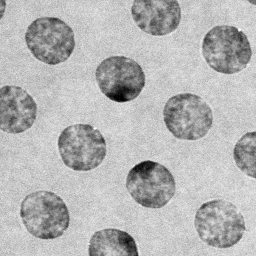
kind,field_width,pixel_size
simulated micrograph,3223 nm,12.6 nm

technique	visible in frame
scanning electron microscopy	a regular array of holes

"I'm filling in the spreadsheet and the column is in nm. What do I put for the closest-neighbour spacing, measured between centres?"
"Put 974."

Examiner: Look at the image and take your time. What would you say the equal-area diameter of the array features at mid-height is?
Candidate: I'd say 621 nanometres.